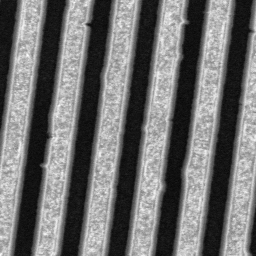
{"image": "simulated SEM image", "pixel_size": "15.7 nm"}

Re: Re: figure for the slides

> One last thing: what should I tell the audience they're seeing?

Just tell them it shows parallel lines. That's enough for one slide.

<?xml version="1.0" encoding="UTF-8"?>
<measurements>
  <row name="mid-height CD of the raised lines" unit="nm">375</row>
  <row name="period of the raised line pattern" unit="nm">730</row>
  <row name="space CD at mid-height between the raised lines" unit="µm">0.361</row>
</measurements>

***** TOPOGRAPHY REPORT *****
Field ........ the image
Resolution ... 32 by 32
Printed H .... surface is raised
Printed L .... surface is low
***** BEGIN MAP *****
LLLHHLLLLHHLLLHHHLLLHHHLLLHHHLLL
LLHHHLLLHHHLLLHHHLLLHHHLLLHHHLLL
LLHHHLLLHHHLLLHHHLLLHHHLLLHHHLLL
LLHHHLLLHHHLLLHHHLLLHHHLLLHHHLLL
LLHHHLLLHHHLLLHHHLLLHHHLLLHHLLLH
LLHHHLLLHHHLLLHHHLLLHHLLLHHHLLLH
LLHHHLLLHHHLLLHHLLLHHHLLLHHHLLLH
LLHHHLLLHHLLLHHHLLLHHHLLLHHHLLLH
LHHHLLLHHHLLLHHHLLLHHHLLLHHHLLLH
LHHHLLLHHHLLLHHHLLLHHHLLLHHHLLLH
LHHHLLLHHHLLLHHHLLLHHHLLLHHHLLLH
LHHHLLLHHHLLLHHHLLLHHHLLLHHHLLHH
LHHHLLLHHHLLLHHHLLLHHHLLHHHLLLHH
LHHHLLLHHHLLLHHHLLHHHLLLHHHLLLHH
LHHHLLHHHLLLHHHLLLHHHLLLHHHLLLHH
LHHHLLHHHLLLHHHLLLHHHLLLHHHLLLHH
HHHLLLHHHLLLHHHLLLHHHLLLHHHLLLHH
HHHLLLHHHLLLHHHLLLHHHLLLHHHLLLHH
HHHLLLHHHLLLHHHLLLHHHLLLHHHLLLHH
HHHLLLHHHLLLHHHLLLHHHLLLHHLLLHHH
HHHLLLHHHLLLHHHLLLHHLLLHHHLLLHHH
HHHLLLHHHLLLHHLLLHHHLLLHHHLLLHHH
HHHLLLHHLLLHHHLLLHHHLLLHHHLLLHHH
HHLLLHHHLLLHHHLLLHHHLLLHHHLLLHHH
HHLLLHHHLLLHHHLLLHHHLLLHHHLLLHHH
HHLLLHHHLLLHHHLLLHHHLLLHHHLLLHHH
HHLLLHHHLLLHHHLLLHHHLLLHHHLLHHHL
HHLLLHHHLLLHHHLLLHHHLLHHHLLLHHHL
HHLLLHHHLLLHHHLLLHHLLLHHHLLLHHHL
HHLLLHHHLLLHHLLLHHHLLLHHHLLLHHHL
HHLLHHHLLLHHHLLLHHHLLLHHHLLLHHHL
HLLLHHHLLLHHHLLLHHHLLLHHHLLLHHHL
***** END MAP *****